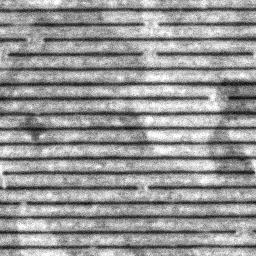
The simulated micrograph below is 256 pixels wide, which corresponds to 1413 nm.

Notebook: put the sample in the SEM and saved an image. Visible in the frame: parallel lines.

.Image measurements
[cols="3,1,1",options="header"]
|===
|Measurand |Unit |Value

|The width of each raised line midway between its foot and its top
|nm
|58.7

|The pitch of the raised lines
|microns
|0.0818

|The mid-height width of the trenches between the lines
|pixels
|3.88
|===